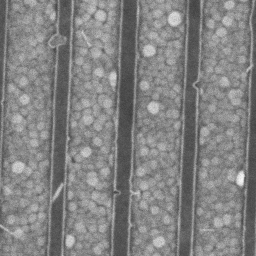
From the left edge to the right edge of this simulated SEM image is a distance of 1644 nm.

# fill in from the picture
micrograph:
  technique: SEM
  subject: one or a few lines or trenches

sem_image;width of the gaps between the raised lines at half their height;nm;313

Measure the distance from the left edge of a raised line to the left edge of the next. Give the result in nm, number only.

415